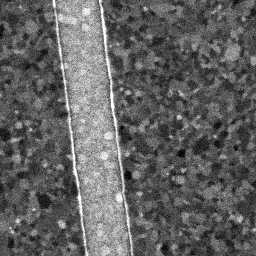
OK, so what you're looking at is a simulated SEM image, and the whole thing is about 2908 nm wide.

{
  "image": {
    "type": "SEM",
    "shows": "one or a few lines or trenches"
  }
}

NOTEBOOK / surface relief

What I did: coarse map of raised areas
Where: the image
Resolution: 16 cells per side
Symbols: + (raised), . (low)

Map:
+++...++++++++++
++++..++++++++++
++++...+++++++++
++++...+++++++++
++++...+++++++++
++++...+++++++++
++++...+++++++++
++++...+++++++++
+++++..+++++++++
+++++..+++++++++
+++++...++++++++
+++++...++++++++
+++++...++++++++
+++++...++++++++
+++++...++++++++
+++++...++++++++